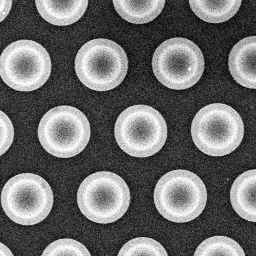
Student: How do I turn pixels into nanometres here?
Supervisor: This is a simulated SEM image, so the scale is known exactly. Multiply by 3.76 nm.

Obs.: an array of small figures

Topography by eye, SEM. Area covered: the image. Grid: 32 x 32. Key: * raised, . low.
*....******...*******...******..
*....******....*****....******..
......****......***......***....
................................
................................
.****......****.....****......**
******....******...******....***
******...*******...******....***
******...*******...******....***
******....******...******....***
.****.....*****.....****......**
................................
................................
.......**.......***......****...
*....******....*****....******..
*....******...*******...******..
**...******...*******...******..
**...******....******...******..
*.....*****....*****.....****...
.......**........**.............
................................
............**.......***.......*
.*****.....****.....*****....***
******....******...*******...***
*******...******...*******...***
*******...******...*******...***
.*****....******....*****.....**
..***......****......***.......*
................................
................................
......****......****.....*****..
*....******....******...******..